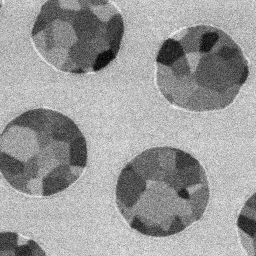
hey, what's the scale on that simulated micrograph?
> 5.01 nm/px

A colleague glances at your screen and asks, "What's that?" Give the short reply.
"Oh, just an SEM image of raised bodies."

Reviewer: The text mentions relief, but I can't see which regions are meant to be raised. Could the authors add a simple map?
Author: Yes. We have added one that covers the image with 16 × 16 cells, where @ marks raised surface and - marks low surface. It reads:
---@@@@---------
--@@@@@@--------
--@@@@@@--@@@@@-
---@@@@---@@@@@-
----@@----@@@@@@
----------@@@@@-
-----------@@@--
-@@@@-----------
@@@@@-----------
@@@@@----@@@----
@@@@@---@@@@@---
@@@@@--@@@@@@---
-------@@@@@@--@
--------@@@@@--@
@--------@@----@
@@@------------@